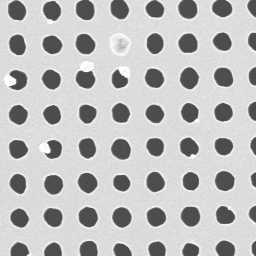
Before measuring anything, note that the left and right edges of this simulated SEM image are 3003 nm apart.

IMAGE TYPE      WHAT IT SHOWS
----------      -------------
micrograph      a regular array of holes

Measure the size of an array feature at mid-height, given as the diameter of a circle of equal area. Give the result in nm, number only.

217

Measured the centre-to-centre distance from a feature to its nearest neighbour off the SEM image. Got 396 nanometers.